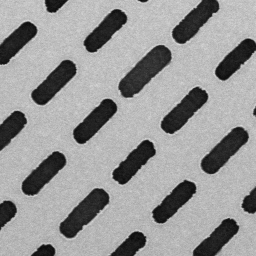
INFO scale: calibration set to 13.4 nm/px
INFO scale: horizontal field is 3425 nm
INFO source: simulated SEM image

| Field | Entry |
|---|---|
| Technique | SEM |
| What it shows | a regular array of holes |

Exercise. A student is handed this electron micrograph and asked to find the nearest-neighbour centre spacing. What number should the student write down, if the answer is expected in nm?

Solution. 753